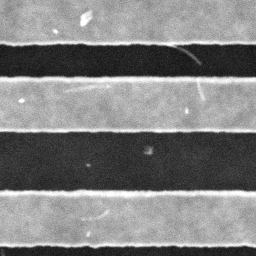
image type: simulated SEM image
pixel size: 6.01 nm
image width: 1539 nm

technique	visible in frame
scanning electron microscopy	lines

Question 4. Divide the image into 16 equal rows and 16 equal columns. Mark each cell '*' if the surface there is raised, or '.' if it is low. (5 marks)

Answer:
****************
****************
****************
................
................
****************
****************
****************
................
................
................
................
****************
****************
****************
................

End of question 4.